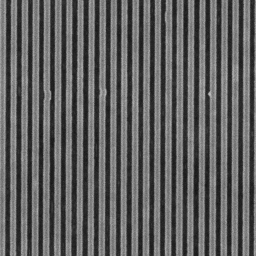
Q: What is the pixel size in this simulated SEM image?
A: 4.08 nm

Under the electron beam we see parallel lines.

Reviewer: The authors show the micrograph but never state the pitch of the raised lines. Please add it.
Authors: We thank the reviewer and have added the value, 0.0452 um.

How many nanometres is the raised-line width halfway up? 22.9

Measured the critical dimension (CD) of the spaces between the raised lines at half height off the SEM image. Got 0.0194 microns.